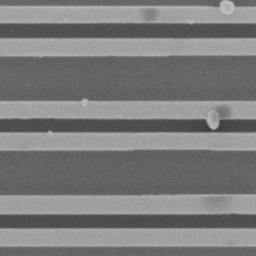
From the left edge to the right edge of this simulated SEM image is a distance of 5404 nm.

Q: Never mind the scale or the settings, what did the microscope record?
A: lines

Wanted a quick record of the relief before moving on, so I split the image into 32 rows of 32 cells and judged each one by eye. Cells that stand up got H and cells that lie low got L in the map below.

LLLLLLLLLLLLLLLLLLLLLLLLLLLLHLLL
HHHHHHHHHHHHHHHHHHHHHHHHHHHHHHHH
HHHHHHHHHHHHHHHHHHHHHHHHHHHHHHHH
LLLLLLLLLLLLLLLLLLLLLLLLLLLLLLLL
LLLLLLLLLLLLLLLLLLLLLLLLLLLLLLLL
HHHHHHHHHHHHHHHHHHHHHHHHHHHHHHHH
HHHHHHHHHHHHHHHHHHHHHHHHHHHHHHHH
LLLLLLLLLLLLLLLLLLLLLLLLLLLLLLLL
LLLLLLLLLLLLLLLLLLLLLLLLLLLLLLLL
LLLLLLLLLLLLLLLLLLLLLLLLLLLLLLLL
LLLLLLLLLLLLLLLLLLLLLLLLLLLLLLLL
LLLLLLLLLLLLLLLLLLLLLLLLLLLLLLLL
LLLLLLLLLLHLLLLLLLLLLLLLLLLLLLLL
HHHHHHHHHHHHHHHHHHHHHHHHHHHHHHHH
HHHHHHHHHHHHHHHHHHHHHHHHHHHHHHHH
LLLLLLLLLLLLLLLLLLLLLLLLLLHLLLLL
LLLLLLLLLLLLLLLLLLLLLLLLLLLLLLLL
HHHHHHHHHHHHHHHHHHHHHHHHHHHHHHHH
HHHHHHHHHHHHHHHHHHHHHHHHHHHHHHHH
LLLLLLLLLLLLLLLLLLLLLLLLLLLLLLLL
LLLLLLLLLLLLLLLLLLLLLLLLLLLLLLLL
LLLLLLLLLLLLLLLLLLLLLLLLLLLLLLLL
LLLLLLLLLLLLLLLLLLLLLLLLLLLLLLLL
LLLLLLLLLLLLLLLLLLLLLLLLLLLLLLLL
LLLLLLLLLLLLLLLLLLLLHHHHHHHHHHHH
HHHHHHHHHHHHHHHHHHHHHHHHHHHHHHHH
HHHHHHHHHHHHHHHHHHHHHHHHHHHHHHHH
LLLLLLLLLLLLLLLLLLLLLLLLLLLLLLLL
LLLLLLLLLLLLLLLLLLLLLLLLLLLLLLLL
HHHHHHHHHHHHHHHHHHHHHHHHHHHHHHHH
HHHHHHHHHHHHHHHHHHHHHHHHHHHHHHHH
LLLLLLLLLLLLLLLLLLLLLLLLLLLLLLLL